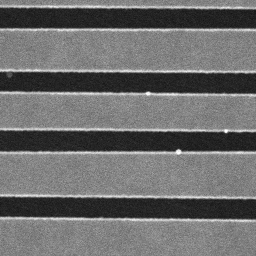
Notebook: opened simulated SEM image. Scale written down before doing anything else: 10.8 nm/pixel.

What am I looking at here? lines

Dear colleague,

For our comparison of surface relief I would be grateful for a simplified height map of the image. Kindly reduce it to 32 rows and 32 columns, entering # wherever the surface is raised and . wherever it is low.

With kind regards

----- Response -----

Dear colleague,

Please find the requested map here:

################################
................................
................................
................................
################################
################################
################################
################################
################################
................................
................................
................................
################################
################################
################################
################################
................................
................................
................................
################################
################################
################################
################################
################################
.###############################
................................
................................
#############################...
################################
################################
################################
################################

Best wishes